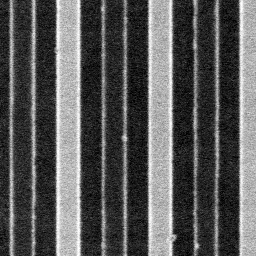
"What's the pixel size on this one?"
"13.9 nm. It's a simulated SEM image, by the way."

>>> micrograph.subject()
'lines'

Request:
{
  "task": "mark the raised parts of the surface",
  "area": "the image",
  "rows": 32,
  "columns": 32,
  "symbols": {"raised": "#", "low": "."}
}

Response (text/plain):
.###...###...###...##...###...##
.###...###...###...##...###...##
.###...###...###...##...###...##
.###...###...###...##...###...##
.###...###...###...##...###...##
.###...###...###...##...###...##
.###...###...###...##...###...##
.###...###...###...##...###...##
.###...###...###...##...###...##
.###...###...###...##...###...##
.###...###...###...##...###...##
.###...###...###...##...###...##
.###...###...###...##...###...##
.###...###...###...##...###...##
.###...###...###...##...###...##
.###...###...###...##...###...##
.###...###...###...##...###...##
.###...###...###...##...###...##
.###...###...###...##...###...##
.###...###...###...##...###...##
.###...###...###...##...###...##
.###...###...###...##...###...##
.###...###...###...##...###...##
.###...###...###...##...###...##
.###...###...###...##...###...##
.###...###...###...##...###...##
.###...###...###...##...###...##
.###...###...###...##...###...##
.###...###...###...##...###...##
.###...###...###...###..###...##
.###...###...###...###..###...##
.###...###...###...##...###...##